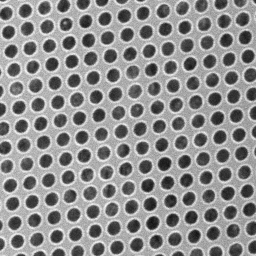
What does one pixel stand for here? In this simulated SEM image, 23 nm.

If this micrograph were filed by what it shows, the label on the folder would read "a regular array of holes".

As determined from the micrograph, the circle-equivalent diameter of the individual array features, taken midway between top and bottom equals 14.6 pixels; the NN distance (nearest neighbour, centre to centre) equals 430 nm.